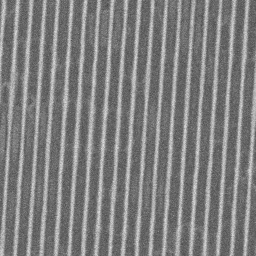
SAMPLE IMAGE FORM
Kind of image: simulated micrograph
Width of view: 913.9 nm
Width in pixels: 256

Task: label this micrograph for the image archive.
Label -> parallel lines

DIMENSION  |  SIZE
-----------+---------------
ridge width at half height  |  2.61 px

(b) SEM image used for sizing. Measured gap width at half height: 36.9 nm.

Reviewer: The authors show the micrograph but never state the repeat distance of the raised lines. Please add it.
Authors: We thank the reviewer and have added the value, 48.1 nm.